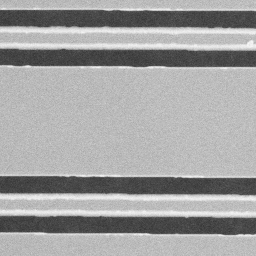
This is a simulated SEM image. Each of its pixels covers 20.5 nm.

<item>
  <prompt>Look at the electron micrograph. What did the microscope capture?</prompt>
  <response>lines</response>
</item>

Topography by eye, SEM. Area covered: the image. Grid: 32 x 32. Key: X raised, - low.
XXXXXXXXXXXXXXXXXXXXXXXXXXXXXXXX
--------------------------------
--------------------------------
XXX-----------------------------
XXXXXXXXXXXXXXXXXXXXXXXXXXXXXXXX
XXXXXXXXXXXXXXXXXXXXXXXXXXXXXXXX
--------------------------------
--------------------------------
XXXXXXXXXXXXXXXXXXXXXXXXXXXXXXXX
XXXXXXXXXXXXXXXXXXXXXXXXXXXXXXXX
XXXXXXXXXXXXXXXXXXXXXXXXXXXXXXXX
XXXXXXXXXXXXXXXXXXXXXXXXXXXXXXXX
XXXXXXXXXXXXXXXXXXXXXXXXXXXXXXXX
XXXXXXXXXXXXXXXXXXXXXXXXXXXXXXXX
XXXXXXXXXXXXXXXXXXXXXXXXXXXXXXXX
XXXXXXXXXXXXXXXXXXXXXXXXXXXXXXXX
XXXXXXXXXXXXXXXXXXXXXXXXXXXXXXXX
XXXXXXXXXXXXXXXXXXXXXXXXXXXXXXXX
XXXXXXXXXXXXXXXXXXXXXXXXXXXXXXXX
XXXXXXXXXXXXXXXXXXXXXXXXXXXXXXXX
XXXXXXXXXXXXXXXXXXXXXXXXXXXXXXXX
XXXXXXXXXXXXXXXXXXXXXXXXXXXXXXXX
--------------------------------
--------------------------------
XXXXXXXXXXXXXXXXXXXXXXXXXXX-X---
XXXXXXXXXXXXXXXXXXXXXXXXXXXXXXXX
XXXXXXXXXXXXXXXXXXXXXXXXXXXXXXXX
--------------------------------
--------------------------------
XXXXXXXXXXXXXXXXXXXXXXXXXXXXXXXX
XXXXXXXXXXXXXXXXXXXXXXXXXXXXXXXX
XXXXXXXXXXXXXXXXXXXXXXXXXXXXXXXX